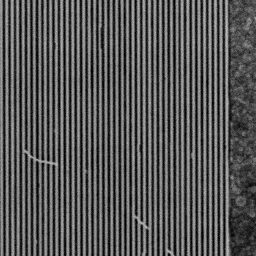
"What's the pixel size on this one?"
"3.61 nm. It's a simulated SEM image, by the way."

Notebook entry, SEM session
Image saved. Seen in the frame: parallel lines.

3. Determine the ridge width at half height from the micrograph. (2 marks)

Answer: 9.9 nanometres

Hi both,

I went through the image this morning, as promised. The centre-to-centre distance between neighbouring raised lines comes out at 0.0198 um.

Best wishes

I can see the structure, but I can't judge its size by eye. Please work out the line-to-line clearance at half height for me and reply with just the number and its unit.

9.9 nanometers